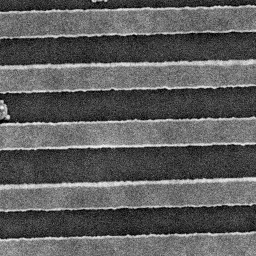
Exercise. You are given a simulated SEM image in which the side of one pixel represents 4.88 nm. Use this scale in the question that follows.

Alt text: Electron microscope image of lines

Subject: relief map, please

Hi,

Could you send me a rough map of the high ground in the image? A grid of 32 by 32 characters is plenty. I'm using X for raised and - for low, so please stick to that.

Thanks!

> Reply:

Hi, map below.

--------------------------------
-XXXXXXXXXXXXXXXXXXXXXXXXXXXXXXX
XXXXXXXXXXXXXXXXXXXXXXXXXXXXXXXX
XXXXXXXXXXXXXXXXXXXXXXXXXXXXXXXX
XXXXXXXXX-----------------------
--------------------------------
--------------------------------
--------------------------------
XXXXXXXXXXXXXXXXXXXXXXXXXXXXXXXX
XXXXXXXXXXXXXXXXXXXXXXXXXXXXXXXX
XXXXXXXXXXXXXXXXXXXXXXXXXXXXXXXX
XXXX----------------------------
--------------------------------
X-------------------------------
--------------------------------
XXXXXXXXXXXXXXXXXXXXXXXXXXXXXXXX
XXXXXXXXXXXXXXXXXXXXXXXXXXXXXXXX
XXXXXXXXXXXXXXXXXXXXXXXXXXXXXXXX
XXXXXXXX------------------------
--------------------------------
--------------------------------
--------------------------------
----------------------------XXXX
XXXXXXXXXXXXXXXXXXXXXXXXXXXXXXXX
XXXXXXXXXXXXXXXXXXXXXXXXXXXXXXXX
XXXXXXXXXXXXXXXXXXXXXXXXXXXXXXXX
--------------------------------
--------------------------------
--------------------------------
---------------XXXXXXXXXXXXXXXXX
XXXXXXXXXXXXXXXXXXXXXXXXXXXXXXXX
XXXXXXXXXXXXXXXXXXXXXXXXXXXXXXXX